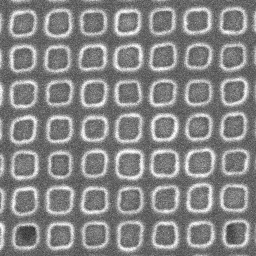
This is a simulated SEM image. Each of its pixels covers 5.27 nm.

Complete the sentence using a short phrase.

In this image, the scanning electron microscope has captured a regular array of holes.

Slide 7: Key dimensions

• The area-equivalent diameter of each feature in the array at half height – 0.124 micrometres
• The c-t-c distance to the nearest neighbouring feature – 184 nm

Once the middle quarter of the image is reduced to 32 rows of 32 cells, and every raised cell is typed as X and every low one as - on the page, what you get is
-XXX-----XXXX------XXX-----XXXXX
XXXXXXXXXXXXXXXXXXXXXXXXXXXXXXXX
XXXXXXXXXXXXXXXXXXXXXXXXXXXXXXXX
XXXXXXXXXXXXXXXXXXXXXXXXXXXXXXXX
XXXXXXX--XXXXXXXXXXXXXXXXX-XXXXX
--XXX-----XXXX-----XXXX-----XXX-
--XXX-----XXX------XXX------XXX-
--XXX-----XXX------XXX------XXX-
-XXXX-----XXX------XXX-----XXXX-
-XXXX-----XXXX----XXXX-----XXXX-
XXXXXXXXXXXXXXXXXXXXXXXXXXXXXXXX
XXXXXXXXXXXXXXXXXXXXXXXXXXXXXXXX
XXXXXXXXXXXXXXXXXXXXXXXXXXXXXXXX
XXXXXXXX-XXXXX-----XXXX----XXXXX
-XXXX-----XXXX-----XXXX-----XXX-
--XXX-----XXX------XXX------XXX-
--XXX------XX------XXX------XXX-
-XXXX-----XXX------XXX-----XXXX-
-XXXX----XXXXX----XXXXX---XXXXXX
XXXXXXXXXXXXXXXXXXXXXXXXXXXXXXXX
XXXXXXXXXXXXXXXXXXXXXXXXXXXXXXXX
XXXXXXXXXXXXXXXXXXXXXXXXXXXXXXXX
XXXXXX----XXXX-----XXXX-----XXXX
-XXXX-----XXXX-----XXX------XXX-
-XXXX-----XXX------XXX------XXX-
-XXXX-----XXX------XXX------XXX-
-XXXX-----XXX------XXX------XXX-
-XXXXX---XXXXX-----XXXX-----XXXX
XXXXXXXXXXXXXXXXXXXXXXXXXXXXXXXX
XXXXXXXXXXXXXXXXXXXXXXXXXXXXXXXX
XXXXXXXXXXXXXXXXXXXXXXXXXXXXXXXX
--XXXX----XXXXX----XXXXX----XXXX